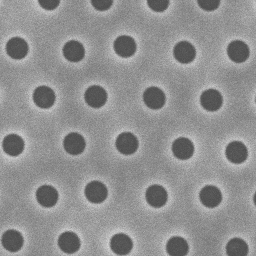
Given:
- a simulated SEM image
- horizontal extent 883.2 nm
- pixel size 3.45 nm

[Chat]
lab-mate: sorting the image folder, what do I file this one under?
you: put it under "a regular array of holes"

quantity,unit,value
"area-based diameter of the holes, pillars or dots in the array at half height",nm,79.7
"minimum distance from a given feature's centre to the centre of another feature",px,52.3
